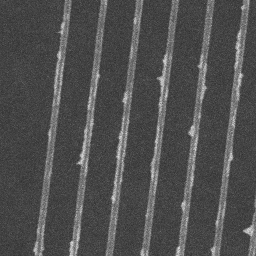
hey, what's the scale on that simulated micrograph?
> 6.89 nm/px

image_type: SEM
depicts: parallel lines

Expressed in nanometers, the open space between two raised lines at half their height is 198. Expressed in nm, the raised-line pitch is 244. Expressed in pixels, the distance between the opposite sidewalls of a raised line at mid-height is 6.21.